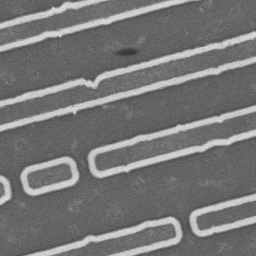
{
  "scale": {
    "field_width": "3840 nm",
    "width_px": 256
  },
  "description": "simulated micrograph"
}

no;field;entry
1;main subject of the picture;one or a few lines or trenches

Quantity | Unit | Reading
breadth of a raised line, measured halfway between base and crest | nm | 348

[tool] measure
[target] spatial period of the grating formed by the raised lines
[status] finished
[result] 1130 nanometers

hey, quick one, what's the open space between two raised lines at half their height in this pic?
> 53.7 pixels